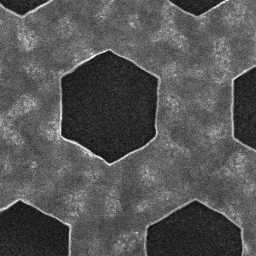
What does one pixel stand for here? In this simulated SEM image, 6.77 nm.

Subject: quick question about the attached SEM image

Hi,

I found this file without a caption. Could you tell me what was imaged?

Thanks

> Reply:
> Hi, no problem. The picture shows holes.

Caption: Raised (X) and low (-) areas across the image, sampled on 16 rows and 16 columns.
--XXXXXXXXX--XXX
XXXXXXXXXXXXXXXX
XXXXXXXXXXXXXXXX
XXXXXX-XXXXXXXXX
XXXX-----XXXXXX-
XXXX------XXXXX-
XXXX------XXXXX-
XXXX------XXXXX-
XXXX------XXXXX-
XXXXXX--XXXXXXXX
XXXXXXXXXXXXXXXX
XXXXXXXXXXXXXXXX
XXXXXXXXXXXXXXXX
---XXXXXXX----XX
----XXXXX------X
----XXXXX------X